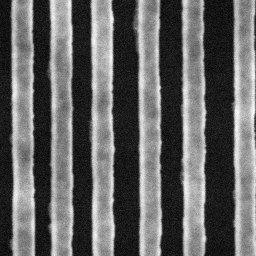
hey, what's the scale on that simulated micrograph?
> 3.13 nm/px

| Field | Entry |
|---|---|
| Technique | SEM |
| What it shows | lines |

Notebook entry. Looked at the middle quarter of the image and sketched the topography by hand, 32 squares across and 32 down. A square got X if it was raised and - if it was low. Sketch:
XX-----XXXXX-------XXXXX------XX
XX-----XXXXX-------XXXXX------XX
XX-----XXXXX-------XXXXX------XX
XX-----XXXXX-------XXXXX------XX
XX-----XXXXX-------XXXXX------XX
XX-----XXXXX-------XXXXX------XX
XX-----XXXXX-------XXXXX------XX
XX-----XXXXX-------XXXXX------XX
XX-----XXXXX-------XXXXX------XX
XX-----XXXXX-------XXXXX------XX
XX-----XXXXX-------XXXXX------XX
XX-----XXXXX-------XXXXX------XX
XX-----XXXXX-------XXXXX------XX
XX-----XXXXX-------XXXXX------XX
XX-----XXXXX-------XXXXX------XX
XX-----XXXXX-------XXXXX------XX
XX-----XXXXX-------XXXXX------XX
XX-----XXXXX-------XXXXX------XX
XX-----XXXXX-------XXXXX------XX
XX-----XXXXX-------XXXXX------XX
XX-----XXXXXX------XXXXX------XX
XX-----XXXXXX------XXXXX------XX
XX-----XXXXX-------XXXXX------XX
XX-----XXXXX-------XXXXX------XX
XX-----XXXXX-------XXXXX------XX
XX-----XXXXX-------XXXXX------XX
XX-----XXXXX-------XXXXX------XX
XX-----XXXXX-------XXXXX------XX
XX-----XXXXX-------XXXXX------XX
XX------XXXX-------XXXXX------XX
XX------XXXX-------XXXXX------XX
XX------XXXX-------XXXXX------XX